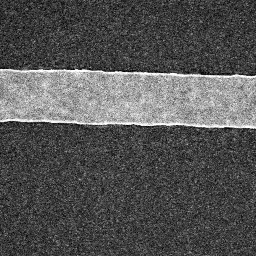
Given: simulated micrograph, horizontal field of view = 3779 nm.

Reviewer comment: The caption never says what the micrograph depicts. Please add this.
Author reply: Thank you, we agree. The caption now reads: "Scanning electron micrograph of one or a few lines or trenches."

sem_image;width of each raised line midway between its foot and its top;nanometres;751